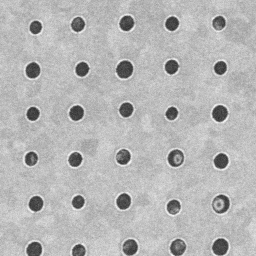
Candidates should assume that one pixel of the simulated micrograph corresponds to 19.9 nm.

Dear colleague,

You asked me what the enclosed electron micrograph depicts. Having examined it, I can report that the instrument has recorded a regular array of holes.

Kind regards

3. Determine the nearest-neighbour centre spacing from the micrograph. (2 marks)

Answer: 860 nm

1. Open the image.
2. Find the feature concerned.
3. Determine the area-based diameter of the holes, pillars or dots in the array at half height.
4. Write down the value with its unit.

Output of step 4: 317 nanometers